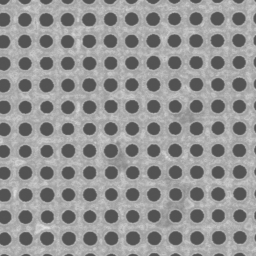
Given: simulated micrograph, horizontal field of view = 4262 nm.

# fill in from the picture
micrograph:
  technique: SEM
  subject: a regular array of holes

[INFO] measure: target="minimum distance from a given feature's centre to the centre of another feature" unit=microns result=0.353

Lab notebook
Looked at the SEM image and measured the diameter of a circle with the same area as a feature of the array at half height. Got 0.228 micrometres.